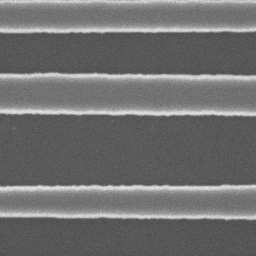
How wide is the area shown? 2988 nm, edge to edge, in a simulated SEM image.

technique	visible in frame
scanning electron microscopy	lines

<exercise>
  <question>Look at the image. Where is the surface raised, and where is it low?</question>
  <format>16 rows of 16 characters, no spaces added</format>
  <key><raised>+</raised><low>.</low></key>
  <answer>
++++++++++++++++
++++++++++++++++
................
................
................
++++++++++++++++
++++++++++++++++
................
................
................
................
................
++++++++++++++++
++++++++++++++++
................
................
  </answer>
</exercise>